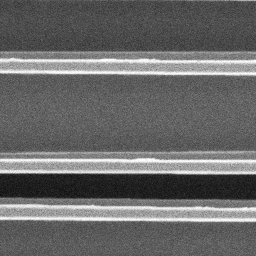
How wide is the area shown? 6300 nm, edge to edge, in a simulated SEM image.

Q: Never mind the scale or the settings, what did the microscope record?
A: lines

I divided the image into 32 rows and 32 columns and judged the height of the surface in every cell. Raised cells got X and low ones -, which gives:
--------------------------------
--------------------------------
--------------------------------
--------------------------------
--------------------------------
--------------------------------
--------------------------------
XXXXXXXXXXXXXXXXXXXXXXXXXXXXXXXX
XXXXXXXXXXXXXXXXXXXXXXXXXXXXXXXX
--------------------------------
--------------------------------
--------------------------------
--------------------------------
--------------------------------
--------------------------------
--------------------------------
--------------------------------
--------------------------------
--------------------------------
XXXXXXXXXXXXXXXXXXXXXXXXXXXXXXXX
XXXXXXXXXXXXXXXXXXXXXXXXXXXXXXXX
XXXXXXXXXXXXXXXXXXXXXXXXXXXXXXXX
--------------------------------
--------------------------------
--------------------------------
XXXXXXXXXXXXXXXXXXXXXXXXXXXXXXXX
XXXXXXXXXXXXXXXXXXXXXXXXXXXXXXXX
---------XXXXXXXXXXXXXXXXXXXXXXX
--------------------------------
--------------------------------
--------------------------------
--------------------------------